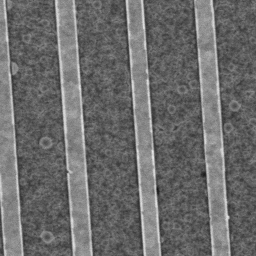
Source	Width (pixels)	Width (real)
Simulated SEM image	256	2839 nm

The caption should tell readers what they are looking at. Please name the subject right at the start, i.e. one or a few lines or trenches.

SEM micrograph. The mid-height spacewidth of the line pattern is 581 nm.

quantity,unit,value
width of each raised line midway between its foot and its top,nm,194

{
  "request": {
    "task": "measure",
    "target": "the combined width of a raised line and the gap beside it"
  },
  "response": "762 nm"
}